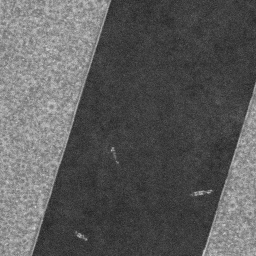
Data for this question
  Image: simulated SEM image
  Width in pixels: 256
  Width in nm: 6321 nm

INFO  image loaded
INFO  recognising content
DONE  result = one or a few lines or trenches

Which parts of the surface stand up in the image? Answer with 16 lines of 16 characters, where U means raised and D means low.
UUUUUUUDDDDDDDDD
UUUUUUDDDDDDDDDD
UUUUUUDDDDDDDDDD
UUUUUUDDDDDDDDDD
UUUUUDDDDDDDDDDD
UUUUUDDDDDDDDDDD
UUUUUDDDDDDDDDDD
UUUUUDDDDDDDDDDU
UUUUDDDDDDDDDDDU
UUUUDDDDDDDDDDDU
UUUUDDDDDDDDDDUU
UUUDDDDDDDDDDDUU
UUUDDDDDDDDDDDUU
UUUDDDDDDDDDDUUU
UUDDDDDDDDDDDUUU
UUDDDDDDDDDDDUUU